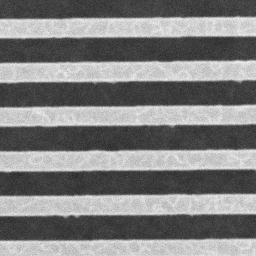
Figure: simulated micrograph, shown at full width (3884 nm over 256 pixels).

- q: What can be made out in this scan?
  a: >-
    lines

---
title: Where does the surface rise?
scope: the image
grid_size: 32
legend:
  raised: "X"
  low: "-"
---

--------------------------------
--------------------------------
XXXXXXXXXXXXXXXXXXXXXXXXXXXXXXXX
XXXXXXXXXXXXXXXXXXXXXXXXXXXXXXXX
XXXXXXXXXXXXXXXXXXXXXXX---------
--------------------------------
--------------------------------
--------------------------------
XXXXXXXXXXXXXXXXXXXXXXXXXXXXXXXX
XXXXXXXXXXXXXXXXXXXXXXXXXXXXXXXX
--------------------------------
--------------------------------
--------------------------------
----XXXXXXXXXXXXXXXXXXXXXXXXXXXX
XXXXXXXXXXXXXXXXXXXXXXXXXXXXXXXX
XXXXXXXXXXXXXXXXXXXXXXXXXXXXXXXX
--------------------------------
--------------------------------
--------------------------------
XXXXXXXXXXXXXXXXXXXXXXXXXXXXXXXX
XXXXXXXXXXXXXXXXXXXXXXXXXXXXXXXX
--------------------------------
--------------------------------
--------------------------------
----------XXXXXXXXXXXXXXXXXXXXXX
XXXXXXXXXXXXXXXXXXXXXXXXXXXXXXXX
XXXXXXXXXXXXXXXXXXXXXXXXXXXXXXXX
--------------------------------
--------------------------------
--------------------------------
XXXXXXXXXXXXXXXXXXXXXXXXXXXXXXXX
XXXXXXXXXXXXXXXXXXXXXXXXXXXXXXXX